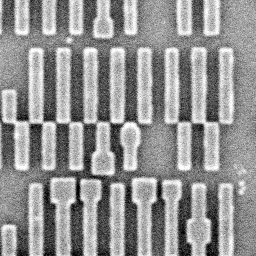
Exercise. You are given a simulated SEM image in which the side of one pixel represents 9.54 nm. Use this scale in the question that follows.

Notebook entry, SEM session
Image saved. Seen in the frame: wiring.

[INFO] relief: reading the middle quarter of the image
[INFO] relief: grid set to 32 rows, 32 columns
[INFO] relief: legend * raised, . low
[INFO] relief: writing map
*....***....***....***....**....
*....***....***....***....**....
*....***....***....***....**....
*....***....***....***....**....
*....***....***....***....**....
*....***....***....***....**....
*....***....***....***....**....
*....***....***....***...***....
*....***....***....***...***....
*....***....***....***...***....
*....***....***....***...***....
*....***....***....***...***....
*....***....***....***...***....
*....***....***....***...***....
*....***....**.....**.....**....
..**....***....***...........**.
..**....***...*****..........**.
..**....***...*****..........**.
..**....***...*****..........**.
..**....***...*****..........**.
..**....***....***...........**.
..***...***....***...........**.
..***..*****...***...........**.
..***..*****...***...........**.
..***..*****...***...........**.
..***..*****...***...........**.
.......*****....................
................................
................................
***.*****........******..****...
***.*****...***..******..****...
***.*****...***..******..****...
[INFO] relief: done